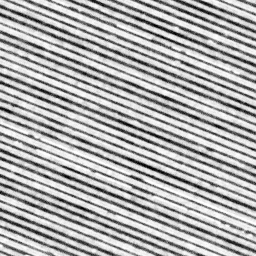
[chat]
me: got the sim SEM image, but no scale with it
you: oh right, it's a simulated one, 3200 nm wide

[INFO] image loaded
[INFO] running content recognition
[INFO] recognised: parallel lines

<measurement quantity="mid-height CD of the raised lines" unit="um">0.048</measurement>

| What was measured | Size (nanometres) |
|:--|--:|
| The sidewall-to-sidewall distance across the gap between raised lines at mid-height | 48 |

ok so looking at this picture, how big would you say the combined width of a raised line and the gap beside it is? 98.3 nanometers